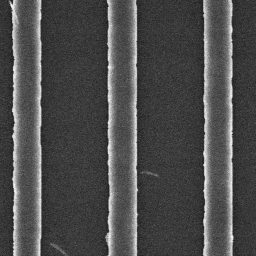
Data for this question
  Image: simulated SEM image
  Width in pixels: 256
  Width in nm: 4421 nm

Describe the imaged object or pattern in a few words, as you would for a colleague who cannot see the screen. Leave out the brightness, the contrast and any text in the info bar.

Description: lines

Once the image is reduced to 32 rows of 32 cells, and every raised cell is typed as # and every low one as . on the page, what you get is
..###.........###........####...
..###.........###........####...
..###.........###.........###...
..###.........###.........###...
..###.........###.........###...
..###.........###.........###...
..###.........###.........###...
..###.........###.........###...
..###.........###.........###...
..###.........###.........###...
..###.........###.........###...
..###.........###.........###...
..###.........###........####...
..###.........###.........###...
..###.........###.........###...
..###.........###.........###...
..###.........###.........###...
..###.........###.........###...
..###.........###.........###...
..###.........###........####...
..###.........###........####...
..###.........###.........###...
..###.........###.........###...
..###.........###........####...
..###.........###.........###...
..###.........###.........###...
..###.........###.........###...
..###.........###........####...
..###.........###.........###...
..###.........###.........###...
..###.........###.........###...
..###.........###........####...